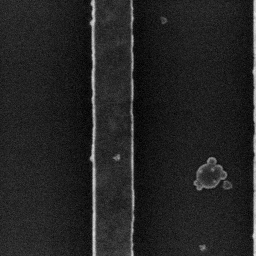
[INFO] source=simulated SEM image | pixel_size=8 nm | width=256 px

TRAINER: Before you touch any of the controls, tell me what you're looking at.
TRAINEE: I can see lines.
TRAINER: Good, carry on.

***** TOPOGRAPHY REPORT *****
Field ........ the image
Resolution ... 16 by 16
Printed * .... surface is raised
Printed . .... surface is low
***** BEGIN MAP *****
......**........
......**........
......**........
......**........
......**........
......**........
......**........
......**........
......**........
......**........
......**........
......**........
......**........
......**........
......**........
......**........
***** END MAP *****